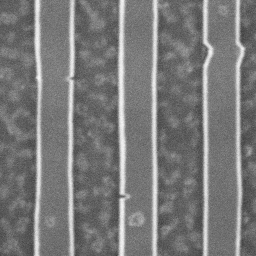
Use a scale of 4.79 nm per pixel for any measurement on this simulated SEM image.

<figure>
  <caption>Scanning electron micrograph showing one or a few lines or trenches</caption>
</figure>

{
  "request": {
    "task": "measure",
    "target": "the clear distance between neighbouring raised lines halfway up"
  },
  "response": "236 nm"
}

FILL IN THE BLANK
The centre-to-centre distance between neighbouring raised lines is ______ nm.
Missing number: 401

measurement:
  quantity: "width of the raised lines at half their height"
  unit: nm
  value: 165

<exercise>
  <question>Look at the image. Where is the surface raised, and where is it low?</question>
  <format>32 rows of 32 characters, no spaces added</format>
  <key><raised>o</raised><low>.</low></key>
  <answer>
.....oooo......ooooo......oooo..
.....oooo......ooooo......oooo..
.....oooo......ooooo......oooo..
.....oooo......ooooo......oooo..
.....oooo......oooo.......oooo..
.....oooo......oooo.......oooo..
.....oooo......oooo.......oooo..
.....oooo......oooo.......oooo..
.....oooo......oooo.......oooo..
.....oooo......oooo.......oooo..
.....oooo......oooo.......oooo..
.....oooo......oooo.......oooo..
.....oooo......oooo.......oooo..
.....oooo......oooo.......oooo..
.....oooo......oooo.......oooo..
.....oooo......oooo.......oooo..
.....oooo......oooo.......oooo..
.....oooo......oooo.......oooo..
.....oooo......oooo.......oooo..
.....oooo......oooo.......oooo..
.....oooo......oooo.......oooo..
.....oooo......oooo.......oooo..
.....oooo......oooo.......oooo..
.....oooo......oooo.......oooo..
.....oooo......oooo.......oooo..
.....oooo......oooo.......oooo..
.....oooo......oooo.......oooo..
....ooooo......oooo.......oooo..
.....oooo......oooo.......oooo..
.....oooo......oooo.......oooo..
.....oooo......oooo.......oooo..
.....oooo......oooo.......oooo..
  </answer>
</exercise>